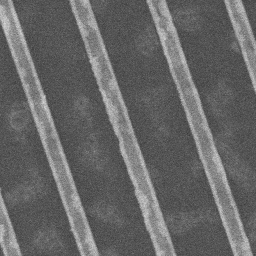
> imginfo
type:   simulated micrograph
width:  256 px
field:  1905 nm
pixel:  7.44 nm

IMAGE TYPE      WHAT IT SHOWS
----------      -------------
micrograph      one or a few lines or trenches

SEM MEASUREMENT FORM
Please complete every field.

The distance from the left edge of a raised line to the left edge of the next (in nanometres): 540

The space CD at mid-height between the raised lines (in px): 57.7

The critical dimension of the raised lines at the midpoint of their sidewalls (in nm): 107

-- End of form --